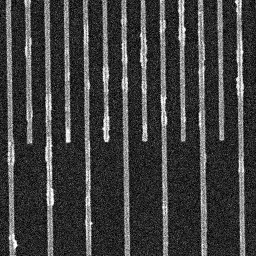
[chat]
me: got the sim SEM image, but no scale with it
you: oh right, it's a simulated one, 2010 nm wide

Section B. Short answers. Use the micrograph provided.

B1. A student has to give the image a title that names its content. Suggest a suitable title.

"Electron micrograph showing parallel lines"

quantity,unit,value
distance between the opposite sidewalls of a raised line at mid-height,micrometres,0.0304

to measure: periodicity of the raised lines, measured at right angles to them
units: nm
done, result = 151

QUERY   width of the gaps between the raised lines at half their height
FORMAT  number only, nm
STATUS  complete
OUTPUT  119